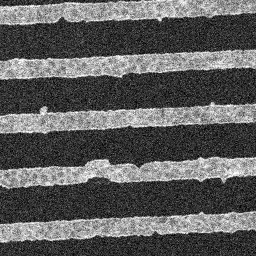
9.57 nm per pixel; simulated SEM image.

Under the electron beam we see parallel lines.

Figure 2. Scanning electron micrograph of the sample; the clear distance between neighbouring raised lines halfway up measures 350 nanometers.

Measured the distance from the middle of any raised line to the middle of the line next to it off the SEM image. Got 0.517 microns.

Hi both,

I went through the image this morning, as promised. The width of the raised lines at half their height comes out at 0.165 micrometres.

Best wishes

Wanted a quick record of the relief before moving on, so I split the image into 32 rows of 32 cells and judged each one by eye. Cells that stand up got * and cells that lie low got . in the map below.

........************************
********************************
*******.*****...................
................................
................................
................................
...........................*****
.*..*.**.***********************
****************************....
***********...*.................
................................
................................
................................
.......................*********
.*******************************
************************........
****.*..........................
................................
................................
................................
...........***....**************
********************************
***********...*******...........
................................
................................
................................
...............................*
...........*********************
********************************
****.*******..*.................
................................
................................